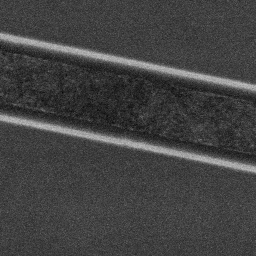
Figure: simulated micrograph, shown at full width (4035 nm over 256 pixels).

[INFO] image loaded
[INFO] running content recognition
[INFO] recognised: one or a few lines or trenches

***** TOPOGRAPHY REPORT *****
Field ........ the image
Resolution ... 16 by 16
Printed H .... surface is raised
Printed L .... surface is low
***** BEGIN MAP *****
HHHHHHHHHHHHHHHH
HHHHHHHHHHHHHHHH
LHHHHHHHHHHHHHHH
LLLLLLHHHHHHHHHH
LLLLLLLLLLLHHHHH
LLLLLLLLLLLLLLLL
LLLLLLLLLLLLLLLL
HLLLLLLLLLLLLLLL
HHHHHHLLLLLLLLLL
HHHHHHHHHHHLLLLL
HHHHHHHHHHHHHHHL
HHHHHHHHHHHHHHHH
HHHHHHHHHHHHHHHH
HHHHHHHHHHHHHHHH
HHHHHHHHHHHHHHHH
HHHHHHHHHHHHHHHH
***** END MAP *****